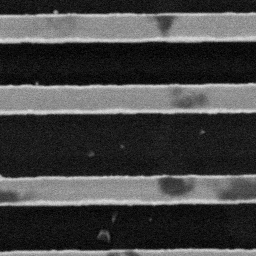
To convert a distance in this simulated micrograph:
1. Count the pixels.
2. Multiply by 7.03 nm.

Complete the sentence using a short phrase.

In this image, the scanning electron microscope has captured lines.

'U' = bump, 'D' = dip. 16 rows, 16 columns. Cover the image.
DDDDDDDDDDDDDDDD
UUUUUUUUUUUUUUUU
UUUUUUUUUUUUUUUU
DDDDDDDDDDDDDDDD
DDDDDDDDDDDDDDDD
UUUUUUUUUUUUUUUU
UUUUUUUUUUUUUUUU
DDDDDDDDDDDDDDDD
DDDDDDDDDDDDDDDD
DDDDDDDDDDDDDDDD
DDDDDDDDDDDDDDDD
UUUUUUUUUUUUUUUU
UUUUUUUUUUUUUUUU
DDDDDDDDDDDDDDDD
DDDDDDDDDDDDDDDD
DDDDDDDDDDDDDDDD